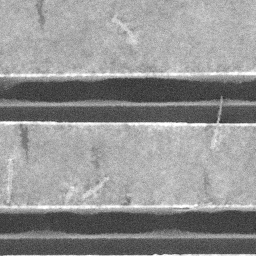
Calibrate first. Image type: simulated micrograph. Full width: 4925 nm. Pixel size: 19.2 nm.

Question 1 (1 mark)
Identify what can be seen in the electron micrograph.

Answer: lines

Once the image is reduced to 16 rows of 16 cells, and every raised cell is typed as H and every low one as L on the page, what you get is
HHHHHHHHHHHHHHHH
HHHHHHHHHHHHHHHH
HHHHHHHHHHHHHHHH
HHHHHHHHHHHHHHHH
HHHHHHHHHHHHHHHH
LLLLLLLLLLLLLLLL
LLLLLLLLLLLLLLLL
LLLLLLLLLLLLLLLL
HHHHHHHHHHHHHHHH
HHHHHHHHHHHHHHHH
HHHHHHHHHHHHHHHH
HHHHHHHHHHHHHHHH
HHHHHHHHHHHHHHHH
LLLLLLLLLLLLLLLL
LLLLLLLLLLLLLLLL
LLLLLLLLLLLLLLLL